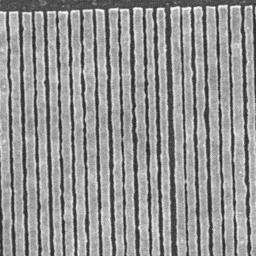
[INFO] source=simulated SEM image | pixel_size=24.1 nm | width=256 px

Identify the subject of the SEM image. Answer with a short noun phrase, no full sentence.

parallel lines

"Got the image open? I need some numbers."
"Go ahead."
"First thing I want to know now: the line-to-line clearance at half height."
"103 nanometers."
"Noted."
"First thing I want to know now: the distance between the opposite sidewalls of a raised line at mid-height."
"205 nanometers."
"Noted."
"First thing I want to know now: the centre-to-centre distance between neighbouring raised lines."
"298 nm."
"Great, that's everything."